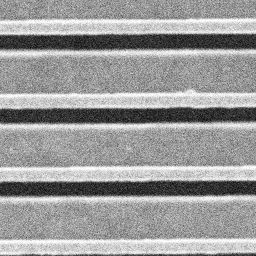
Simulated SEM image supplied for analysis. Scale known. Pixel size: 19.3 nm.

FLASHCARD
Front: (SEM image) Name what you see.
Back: lines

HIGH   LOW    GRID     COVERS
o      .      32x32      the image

oooooooooooooooooooooooooooooooo
oooooooooooooooooooooooooooooooo
oooooooooooooooooooooooooooooooo
oooooooooooooooooooooooooooooooo
................................
................................
...........ooooooooooooooooooooo
oooooooooooooooooooooooooooooooo
oooooooooooooooooooooooooooooooo
oooooooooooooooooooooooooooooooo
oooooooooooooooooooooooooooooooo
oooooooooooooooooooooooooooooooo
oooooooooooooooooooooooooooooooo
.oo.............................
................................
................................
oooooooooooooooooooooooooooooooo
oooooooooooooooooooooooooooooooo
oooooooooooooooooooooooooooooooo
oooooooooooooooooooooooooooooooo
oooooooooooooooooooooooooooooooo
oooooooooooooooooooooooooooooooo
ooooooooooooooooooo.............
................................
................................
oooooooooooooooooooooooooooooooo
oooooooooooooooooooooooooooooooo
oooooooooooooooooooooooooooooooo
oooooooooooooooooooooooooooooooo
oooooooooooooooooooooooooooooooo
oooooooooooooooooooooooooooooooo
oooooooooooooooooooooooooooooooo